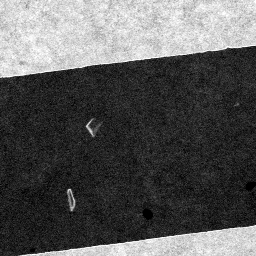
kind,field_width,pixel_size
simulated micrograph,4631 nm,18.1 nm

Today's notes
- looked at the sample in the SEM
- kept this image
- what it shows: one or a few lines or trenches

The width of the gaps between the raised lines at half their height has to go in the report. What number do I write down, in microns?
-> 3.24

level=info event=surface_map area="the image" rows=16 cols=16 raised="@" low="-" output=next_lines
@@@@@@@@@@@@@@@@
@@@@@@@@@@@@@@@@
@@@@@@@@@@@@@@@@
@@@@@@@@@@@-----
@@@-------------
----------------
----------------
----------------
----------------
----------------
----------------
----------------
----------------
----------------
-------------@@@
-----@@@@@@@@@@@